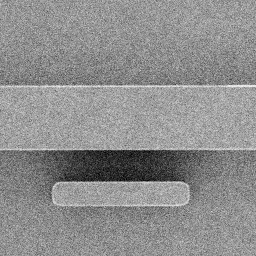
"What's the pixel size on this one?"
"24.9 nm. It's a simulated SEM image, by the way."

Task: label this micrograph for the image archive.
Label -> groups of lines, slits or small figures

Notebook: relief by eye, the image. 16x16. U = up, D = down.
DDDDDDDDDDDDDDDD
DDDDDDDDDDDDDDDD
DDDDDDDDDDDDDDDD
DDDDDDDDDDDDDDDD
DDDDDDDDDDDDDDDD
UUUUUUUUUUUUUUUU
UUUUUUUUUUUUUUUU
UUUUUUUUUUUUUUUU
UUUUUUUUUUUUUUUU
DDDDDDDDDDDDDDDD
DDDDDDDDDDDDDDDD
DDDDUUUUUUUDDDDD
DDDUUUUUUUUUDDDD
DDDDDDDDDDDDDDDD
DDDDDDDDDDDDDDDD
DDDDDDDDDDDDDDDD